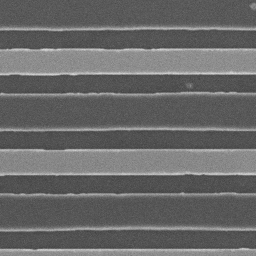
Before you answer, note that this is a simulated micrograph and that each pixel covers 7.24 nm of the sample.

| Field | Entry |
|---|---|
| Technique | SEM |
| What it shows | lines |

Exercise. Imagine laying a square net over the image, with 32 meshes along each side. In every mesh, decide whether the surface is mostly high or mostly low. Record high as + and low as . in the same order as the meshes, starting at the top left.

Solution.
++++++++++++++++++++++++++++++++
++++++++++++++++++++++++++++++++
++++++++++++++++++++++++++++++++
++++++++++++++++++..+..+++++++++
................................
................................
++++++++++++++++++++++++++++++++
++++++++++++++++++++++++++++++++
++++++++++++++++++++++++++++++++
................................
................................
................................
++++++++++++++++++++++++++++++++
++++++++++++++++++++++++++++++++
++++++++++++++++++++++++++++++++
++++++++++++++++++++++++++++++++
................................
................................
................................
++++++++++++++++++++++++++++++++
++++++++++++++++++++++++++++++++
++++++++++++++++++++++++++++++++
................................
................................
++++++++++++++++++++++++++++++++
++++++++++++++++++++++++++++++++
++++++++++++++++++++++++++++++++
++++++++++++++++++++++++++++++++
++++++++++++++++++++++++++++++++
................................
................................
++++++++++++++++++++++++++++++++